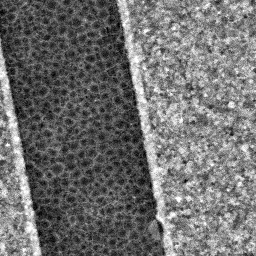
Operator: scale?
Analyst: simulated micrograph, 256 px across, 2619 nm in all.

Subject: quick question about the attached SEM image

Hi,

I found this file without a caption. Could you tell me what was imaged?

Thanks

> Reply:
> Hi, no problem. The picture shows one or a few lines or trenches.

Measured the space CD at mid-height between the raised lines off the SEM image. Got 1340 nanometers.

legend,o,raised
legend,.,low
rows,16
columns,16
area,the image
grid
........oooooooo
........oooooooo
........oooooooo
........oooooooo
........oooooooo
.........ooooooo
o........ooooooo
o........ooooooo
o........ooooooo
o........ooooooo
o.........oooooo
o.........oooooo
oo........oooooo
oo........oooooo
oo........oooooo
oo.........ooooo